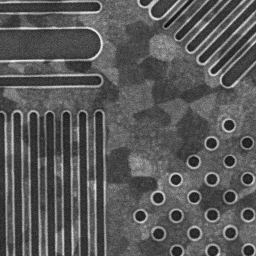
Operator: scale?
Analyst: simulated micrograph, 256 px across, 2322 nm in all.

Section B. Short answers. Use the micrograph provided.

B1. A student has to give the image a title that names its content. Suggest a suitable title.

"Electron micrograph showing groups of lines, slits or small figures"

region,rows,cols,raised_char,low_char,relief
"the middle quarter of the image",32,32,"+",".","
++++++++++++++++++++++++++++++++
++++++++++++++++++++++++++++++++
++++++++++++++++++++++++++++++++
.........+++++++++++++++++++++++
.........+++++++++++++++++++++++
........++++++++++++++++++++++++
++++++++++++++++++++++++++++++++
++++++++++++++++++++++++++++++++
++++++++++++++++++++++++++++++++
++++++++++++++++++++++++++++++++
++++++++++++++++++++++++++++++++
++++++++++++++++++++++++++++++++
..++..++..++++++++++++++++++++++
..+...++..++++++++++++++++++++++
..+...++..++++++++++++++++++++++
..+...++..++++++++++++++++++++++
..+...++..++++++++++++++++++++++
..+...++..++++++++++++++++++++++
..+...++..++++++++++++++++++++++
..+...++..++++++++++++++++++++++
..+...++..++++++++++++++++++++++
..+...++..++++++++++++++++++++++
..+...++..++++++++++++++++++++++
..++..++..+++++++++++++++++++++.
..++..++..+++++++++++++++++++++.
..+...++..+++++++++++++++++++++.
..+...++..++++++++++++++++++++++
..+...++..+++++++++++++++++..+++
..++..++..+++++++++++++++++..+++
..++..++..+++++++++++++++++..+++
..++..++..++++++++++++++++++++++
..++..++..++++++++++++++++++++++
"